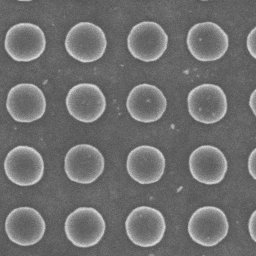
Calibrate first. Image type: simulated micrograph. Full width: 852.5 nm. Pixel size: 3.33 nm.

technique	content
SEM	a regular array of raised bodies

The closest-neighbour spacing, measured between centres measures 200 nm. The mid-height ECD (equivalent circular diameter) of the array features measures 129 nanometers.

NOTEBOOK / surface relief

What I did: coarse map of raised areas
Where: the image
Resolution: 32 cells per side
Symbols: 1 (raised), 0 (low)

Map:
00000000000000000000000000000000
00000000000000000000000000000000
00000000000000000000000000000000
00111000011100000111000011100000
01111000111110001111100011110001
01111100111110001111100011110001
01111000011110001111000011110001
00110000001100000010000001100000
00000000000000000000000000000000
00000000000000000000000000000000
00010000000000000000000000000000
01111000011110001111000011110000
01111100111110001111100011110001
01111100111110001111100011110001
01111000011100000111000011110000
00000000000000000000000000000000
00000000000000000000000000000000
00000000000000000000000000000000
00110000011100000110000001100000
01111000111110001111000011110001
01111000111110001111100011110001
01111000111110001111000011110001
00111000011100000111000001100000
00000000000000000000000000000000
00000000000000000000000000000000
00000000000000000000000000000000
00111000011100000111000011110000
01111000111110001111000011110001
01111100111110001111000011110001
01111000011110001111000011110001
00110000011100000110000001100000
00000000000000000000000000000000